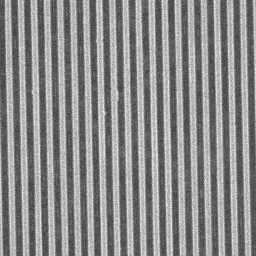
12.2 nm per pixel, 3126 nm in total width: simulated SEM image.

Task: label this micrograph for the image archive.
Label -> parallel lines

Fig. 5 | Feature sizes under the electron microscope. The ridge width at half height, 83.9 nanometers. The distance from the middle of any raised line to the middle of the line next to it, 159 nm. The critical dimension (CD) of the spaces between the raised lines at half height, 83.9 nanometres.